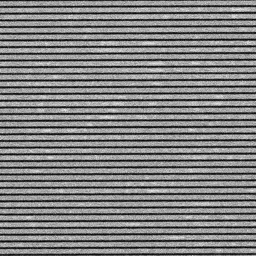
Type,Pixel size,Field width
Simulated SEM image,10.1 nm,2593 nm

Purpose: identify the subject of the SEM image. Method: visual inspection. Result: parallel lines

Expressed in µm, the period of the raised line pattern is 0.0678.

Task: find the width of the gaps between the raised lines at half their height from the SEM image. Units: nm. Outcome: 17.7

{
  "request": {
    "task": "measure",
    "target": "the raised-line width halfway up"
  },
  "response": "44.3 nm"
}